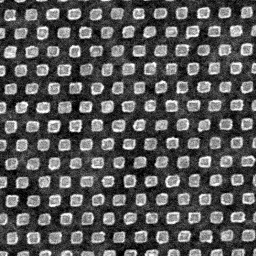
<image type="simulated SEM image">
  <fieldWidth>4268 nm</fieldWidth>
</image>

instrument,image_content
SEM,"a regular array of raised bodies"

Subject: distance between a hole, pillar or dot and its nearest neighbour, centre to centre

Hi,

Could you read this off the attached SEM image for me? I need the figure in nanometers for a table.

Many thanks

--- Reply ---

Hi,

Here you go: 351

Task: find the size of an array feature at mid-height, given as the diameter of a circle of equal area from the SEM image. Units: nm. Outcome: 197